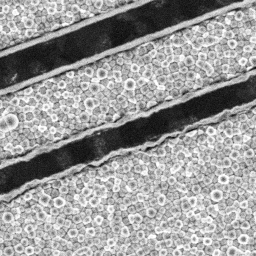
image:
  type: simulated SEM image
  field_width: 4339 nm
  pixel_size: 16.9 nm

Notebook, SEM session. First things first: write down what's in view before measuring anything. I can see one or a few lines or trenches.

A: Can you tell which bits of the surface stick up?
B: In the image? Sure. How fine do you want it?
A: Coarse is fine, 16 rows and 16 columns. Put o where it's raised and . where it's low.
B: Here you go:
........oooooo..
.....ooooooo....
...oooooo.......
oooooo..........
ooo.............
o............ooo
...........ooooo
........ooooo...
.....oooooo.....
..oooooo........
ooooo...........
oo..............
................
................
................
................